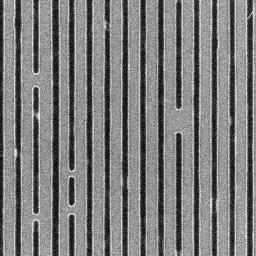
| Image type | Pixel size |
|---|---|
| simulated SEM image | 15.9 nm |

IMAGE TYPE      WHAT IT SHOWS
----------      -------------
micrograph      parallel lines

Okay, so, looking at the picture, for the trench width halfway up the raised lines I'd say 10.4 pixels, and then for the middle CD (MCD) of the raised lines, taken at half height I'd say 119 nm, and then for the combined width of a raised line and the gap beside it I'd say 284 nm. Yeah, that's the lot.